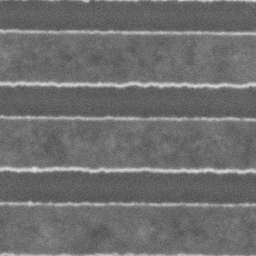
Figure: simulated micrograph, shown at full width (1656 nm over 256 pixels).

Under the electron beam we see lines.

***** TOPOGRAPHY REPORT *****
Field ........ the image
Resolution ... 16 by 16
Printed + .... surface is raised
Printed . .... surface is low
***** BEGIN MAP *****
................
................
++++++++++++++++
++++++++++++++++
++++++++++++++++
................
................
++++++++++++++++
++++++++++++++++
++++++++++++++++
++++++++++++++++
................
................
++++++++++++++++
++++++++++++++++
++++++++++++++++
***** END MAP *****